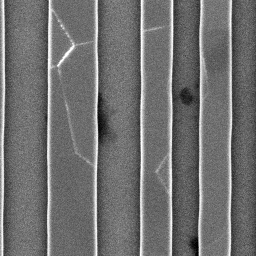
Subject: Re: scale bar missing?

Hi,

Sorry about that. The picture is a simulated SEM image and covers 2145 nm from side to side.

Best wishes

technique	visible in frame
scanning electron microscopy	groups of lines, slits or small figures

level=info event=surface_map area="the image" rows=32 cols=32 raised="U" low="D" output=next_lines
DDDDDDUUUUUUDDDDDDUUUUDDDUUUUDDD
DDDDDDUUUUUUDDDDDDUUUUDDDUUUUDDD
DDDDDDUUUUUUDDDDDDUUUUDDDUUUUDDD
DDDDDDUUUUUUDDDDDDUUUUDDDUUUUDDD
DDDDDDUUUUUUDDDDDDUUUUDDDUUUUDDD
DDDDDDUUUUUUDDDDDDUUUUDDDUUUUDDD
DDDDDDUUUUUUDDDDDDUUUUDDDUUUUDDD
DDDDDDUUUUUUDDDDDDUUUUDDDUUUUDDD
DDDDDDUUUUUUDDDDDDUUUDDDDUUUUDDD
DDDDDDUUUUUUDDDDDDUUUDDDDUUUUDDD
UDDDDDUUUUUUDDDDDDUUUDDDDUUUUDDD
UDDDDDUUUUUUDDDDDDUUUDDDDUUUUDDD
DDDDDDUUUUUUDDDDDDUUUDDDDUUUUDDD
DDDDDDUUUUUUDDDDDDUUUDDDDUUUUDDD
DDDDDDUUUUUUDDDDDDUUUDDDDUUUUDDD
DDDDDDUUUUUUDDDDDDUUUDDDDUUUUDDD
DDDDDDUUUUUUDDDDDDUUUDDDDUUUUDDD
DDDDDDUUUUUUDDDDDDUUUDDDDUUUUDDD
DDDDDDUUUUUUDDDDDDUUUDDDDUUUUDDD
DDDDDDUUUUUUDDDDDDUUUDDDDUUUUDDD
DDDDDDUUUUUUDDDDDDUUUDDDDUUUUDDD
DDDDDDUUUUUUDDDDDDUUUDDDDUUUUDDD
DDDDDDUUUUUUDDDDDDUUUDDDDUUUUDDD
DDDDDDUUUUUUDDDDDDUUUDDDDUUUUDDD
DDDDDDUUUUUUDDDDDDUUUDDDDUUUUDDD
DDDDDDUUUUUUDDDDDDUUUDDDDUUUUDDD
DDDDDDUUUUUUDDDDDDUUUDDDDUUUUDDD
DDDDDDUUUUUUDDDDDDUUUDDDDUUUUDDD
DDDDDDUUUUUUDDDDDDUUUDDDDUUUUDDD
DDDDDDUUUUUUDDDDDDUUUDDDDUUUUDDD
DDDDDDUUUUUUDDDDDDUUUDDDDUUUUDDD
DDDDDDUUUUUUDDDDDDUUUDDDDUUUUDDD